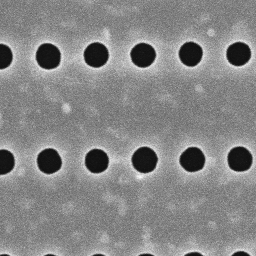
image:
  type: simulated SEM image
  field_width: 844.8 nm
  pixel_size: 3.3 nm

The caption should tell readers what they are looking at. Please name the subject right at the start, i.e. a regular array of holes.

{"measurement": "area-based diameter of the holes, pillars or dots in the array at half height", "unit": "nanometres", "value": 84.8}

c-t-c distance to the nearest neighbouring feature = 156 nm